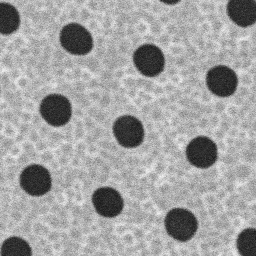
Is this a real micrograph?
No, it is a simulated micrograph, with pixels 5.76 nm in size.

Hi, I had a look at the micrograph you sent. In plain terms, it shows a regular array of holes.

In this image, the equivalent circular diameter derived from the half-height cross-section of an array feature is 194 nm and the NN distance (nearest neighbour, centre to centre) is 425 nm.